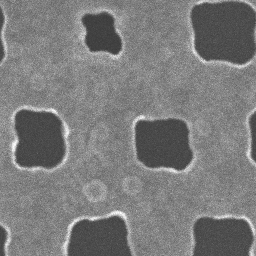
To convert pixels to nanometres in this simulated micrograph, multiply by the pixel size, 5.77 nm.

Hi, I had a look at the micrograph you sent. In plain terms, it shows holes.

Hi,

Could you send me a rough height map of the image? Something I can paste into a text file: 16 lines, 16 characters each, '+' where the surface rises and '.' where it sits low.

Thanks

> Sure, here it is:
++++++++++++....
+++++..+++++....
+++++...++++....
+++++++++++++...
++++++++++++++++
++++++++++++++++
++++++++++++++++
+...+++++..+++++
+...++++....++++
+...++++....++++
+++++++++++.++++
++++++++++++++++
++++++++++++++++
++++++++++++++++
++++....++++....
++++....++++....